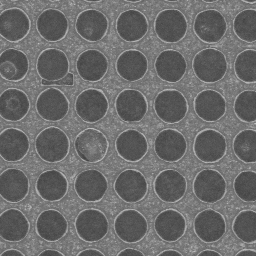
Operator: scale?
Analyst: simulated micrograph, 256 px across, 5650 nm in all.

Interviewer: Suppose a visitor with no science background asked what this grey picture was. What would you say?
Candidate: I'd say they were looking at a regular array of holes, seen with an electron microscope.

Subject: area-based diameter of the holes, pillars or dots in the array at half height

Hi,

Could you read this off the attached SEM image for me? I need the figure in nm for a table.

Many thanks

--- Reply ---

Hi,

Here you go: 711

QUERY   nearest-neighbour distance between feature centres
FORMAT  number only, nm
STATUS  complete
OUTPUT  861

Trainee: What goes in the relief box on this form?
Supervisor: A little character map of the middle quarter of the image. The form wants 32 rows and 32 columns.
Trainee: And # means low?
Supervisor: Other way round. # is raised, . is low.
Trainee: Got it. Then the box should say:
.##........##........##........#
.##........##........##........#
..##......####......###.......##
..##.....######....#####.....###
..#########################.####
################################
#####....######...########.#####
####......####......####.....###
.##.......###.......###.......##
.##........##........##........#
.##........##........#.........#
.##........##........##........#
.##.......###.......###........#
####......####......####......##
######..########..#######...####
################################
#####...########..#######...####
####......####.....#####.....###
.##.......###.......###.......##
.##........##........##.......##
.##........##........##........#
.##........##........##.......##
.##....##.####......###.......##
####...#..#####....#####.....###
#################.########.#####
################################
######..########..#######...####
####......####.....#####.....###
###.......###.......###.......##
.##........##.......###.......##
.##........##........#.........#
.##........##........##.......##